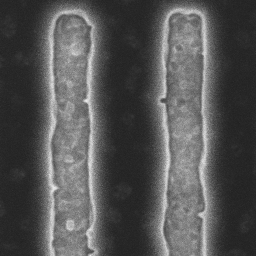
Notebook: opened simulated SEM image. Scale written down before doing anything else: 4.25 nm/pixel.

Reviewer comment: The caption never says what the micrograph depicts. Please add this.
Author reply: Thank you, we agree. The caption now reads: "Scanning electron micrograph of one or a few lines or trenches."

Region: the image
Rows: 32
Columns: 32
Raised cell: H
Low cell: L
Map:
HHHHHHHHHHHHHHHHHHHHHHHHHHHHHHHH
HHHHHHHHHHHHHHHHHHHHHHLLHHHHHHHH
HHHHHHHLLLLHHHHHHHHHHLLLLHHHHHHH
HHHHHHHLLLLHHHHHHHHHHLLLLHHHHHHH
HHHHHHHLLLLHHHHHHHHHHLLLLHHHHHHH
HHHHHHHLLLLHHHHHHHHHHLLLLLHHHHHH
HHHHHHHLLLLHHHHHHHHHHLLLLHHHHHHH
HHHHHHHLLLLHHHHHHHHHLLLLLLHHHHHH
HHHHHHLLLLLHHHHHHHHHHLLLLHHHHHHH
HHHHHHHLLLLHHHHHHHHHHLLLLHHHHHHH
HHHHHHHLLLLHHHHHHHHHHLLLLHHHHHHH
HHHHHHHLLLLHHHHHHHHHHLLLLHHHHHHH
HHHHHHHLLLLHHHHHHHHHLLLLLHHHHHHH
HHHHHHHLLLLHHHHHHHHHHLLLLHHHHHHH
HHHHHHHLLLLHHHHHHHHHHLLLLHHHHHHH
HHHHHHHLLLLHHHHHHHHHHLLLLHHHHHHH
HHHHHHHLLLLHHHHHHHHHHLLLLHHHHHHH
HHHHHHLLLLLHHHHHHHHHHLLLLLHHHHHH
HHHHHHLLLLLHHHHHHHHHHLLLLLHHHHHH
HHHHHHLLLLLHHHHHHHHHHLLLLHHHHHHH
HHHHHHLLLLLHHHHHHHHHHLLLLHHHHHHH
HHHHHHHLLLLHHHHHHHHHHLLLLHHHHHHH
HHHHHHHLLLLHHHHHHHHHHLLLLHHHHHHH
HHHHHHHLLLLHHHHHHHHHHLLLLHHHHHHH
HHHHHHHLLLLHHHHHHHHHHLLLLLHHHHHH
HHHHHHHLLLLHHHHHHHHHHLLLLLHHHHHH
HHHHHHHLLLLLHHHHHHHHHLLLLHHHHHHH
HHHHHHHLLLLLHHHHHHHHLLLLLHHHHHHH
HHHHHHHLLLLHHHHHHHHHLLLLLHHHHHHH
HHHHHHHLLLLHHHHHHHHHLLLLLHHHHHHH
HHHHHHHLLLLHHHHHHHHHHLLLLHHHHHHH
HHHHHHHLLLLLHHHHHHHHHLLLLHHHHHHH